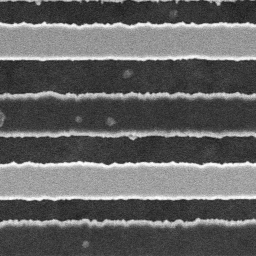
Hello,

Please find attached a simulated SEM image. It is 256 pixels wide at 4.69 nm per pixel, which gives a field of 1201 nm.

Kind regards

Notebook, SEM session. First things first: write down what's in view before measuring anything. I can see lines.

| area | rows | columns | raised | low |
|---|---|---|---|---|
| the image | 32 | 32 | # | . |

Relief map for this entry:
................................
................................
................................
################################
################################
################################
################################
.....#...#.......#...........#..
................................
................................
................................
................................
################################
################################
################################
################################
################################
................................
................................
................................
.#.##.#######.###########.#.####
################################
################################
################################
################################
................................
................................
................................
################################
################################
################################
################################